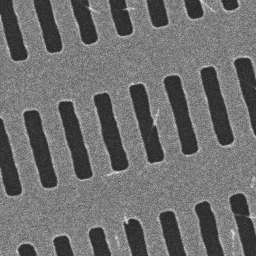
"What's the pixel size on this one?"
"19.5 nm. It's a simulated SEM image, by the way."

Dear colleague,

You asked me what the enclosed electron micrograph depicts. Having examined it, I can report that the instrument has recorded holes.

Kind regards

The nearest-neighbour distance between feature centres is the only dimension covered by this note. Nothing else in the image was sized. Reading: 0.702 microns